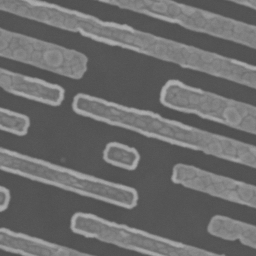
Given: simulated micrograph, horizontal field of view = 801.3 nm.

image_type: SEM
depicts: parallel lines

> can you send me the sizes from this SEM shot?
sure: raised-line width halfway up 0.0654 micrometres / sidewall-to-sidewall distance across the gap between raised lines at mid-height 53.5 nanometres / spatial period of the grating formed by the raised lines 119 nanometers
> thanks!